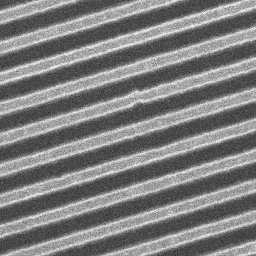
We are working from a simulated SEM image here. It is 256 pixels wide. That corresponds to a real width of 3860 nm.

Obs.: parallel lines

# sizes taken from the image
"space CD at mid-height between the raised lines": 0.237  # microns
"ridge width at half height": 208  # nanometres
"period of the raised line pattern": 442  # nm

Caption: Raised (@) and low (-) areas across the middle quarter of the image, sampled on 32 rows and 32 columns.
@-------------@@@@@@@@@@@@------
-----------@@@@@@@@@@@@---------
-------@@@@@@@@@@@@-------------
----@@@@@@@@@@@@--------------@@
-@@@@@@@@@@@@-------------@@@@@@
@@@@@@@@@--------------@@@@@@@@@
@@@@@---------------@@@@@@@@@@@@
@@@-------------@@@@@@@@@@@@----
------------@@@@@@@@@@@@@-------
---------@@@@@@@@@@@@@----------
------@@@@@@@@@@@--------------@
---@@@@@@@@@@@@--------------@@@
@@@@@@@@@@@@-------------@@@@@@@
@@@@@@@@--------------@@@@@@@@@@
@@@@@--------------@@@@@@@@@@@@-
@@-------------@@@@@@@@@@@@-----
------------@@@@@@@@@@@@--------
---------@@@@@@@@@@@@-----------
-----@@@@@@@@@@@@--------------@
-@@@@@@@@@@@@@--------------@@@@
@@@@@@@@@@@--------------@@@@@@@
@@@@@@@--------------@@@@@@@@@@@
@@@@-------------@@@@@@@@@@@@@--
@-------------@@@@@@@@@@@@------
-----------@@@@@@@@@@@@---------
--------@@@@@@@@@@@-------------
----@@@@@@@@@@@@--------------@@
@@@@@@@@@@@@@-------------@@@@@@
@@@@@@@@@--------------@@@@@@@@@
@@@@@@-------------@@@@@@@@@@@@-
@@@-------------@@@@@@@@@@@@----
-------------@@@@@@@@@@@@-------